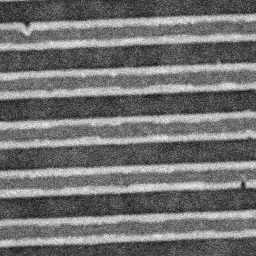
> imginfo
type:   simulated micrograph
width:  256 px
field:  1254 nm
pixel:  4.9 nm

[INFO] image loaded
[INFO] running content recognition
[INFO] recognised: parallel lines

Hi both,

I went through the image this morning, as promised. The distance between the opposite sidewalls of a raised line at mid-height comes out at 105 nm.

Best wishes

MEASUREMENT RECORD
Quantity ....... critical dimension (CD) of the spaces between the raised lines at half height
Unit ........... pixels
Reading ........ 28.1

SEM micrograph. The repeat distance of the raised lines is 240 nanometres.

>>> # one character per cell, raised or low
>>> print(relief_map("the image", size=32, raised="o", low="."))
................................
................................
.....................ooooooooooo
ooo.oooooooooooooooooooooooooooo
oooooooooooooooooooooooooooooooo
oooooooooo......................
................................
................................
.........................ooooooo
.ooooooooooooooooooooooooooooooo
oooooooooooooooooooooooooooooooo
ooooooooooooooo.................
................................
................................
...........................ooooo
...ooooooooooooooooooooooooooooo
oooooooooooooooooooooooooooooooo
ooooooooooooooooo...............
................................
................................
................................
......oooooooooooooooooooooooooo
oooooooooooooooooooooooooooooooo
ooooooooooooooooooo.............
................................
................................
................................
..........o..ooooooooooooooooooo
oooooooooooooooooooooooooooooooo
oooooooooooooooooooooooo........
................................
................................